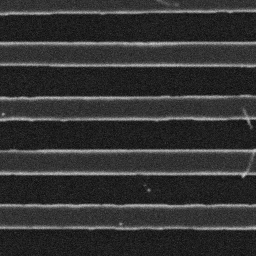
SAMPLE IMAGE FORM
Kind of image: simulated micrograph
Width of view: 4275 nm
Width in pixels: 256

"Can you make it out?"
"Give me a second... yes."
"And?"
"lines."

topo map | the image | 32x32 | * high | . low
********************************
***************************.*...
................................
................................
................................
********************************
********************************
********************************
................................
................................
................................
................................
********************************
********************************
********************************
................................
................................
................................
................................
********************************
********************************
********************************
................................
................................
................................
................................
********************************
********************************
********************************
................................
................................
................................